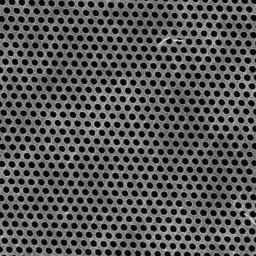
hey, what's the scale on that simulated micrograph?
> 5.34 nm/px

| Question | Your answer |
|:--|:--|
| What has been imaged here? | a regular array of holes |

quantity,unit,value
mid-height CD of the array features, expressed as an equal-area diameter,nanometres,33.5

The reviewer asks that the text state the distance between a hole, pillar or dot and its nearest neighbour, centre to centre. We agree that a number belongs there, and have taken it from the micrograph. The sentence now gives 50.6 nm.